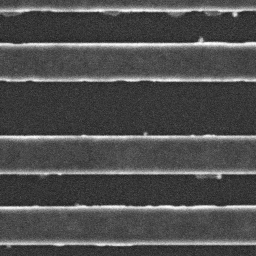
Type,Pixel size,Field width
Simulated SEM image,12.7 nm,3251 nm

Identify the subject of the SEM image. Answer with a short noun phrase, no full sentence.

lines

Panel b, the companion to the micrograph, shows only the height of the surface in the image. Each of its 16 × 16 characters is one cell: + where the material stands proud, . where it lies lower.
++++++++++++++++
................
................
++++++++++++++++
++++++++++++++++
................
................
................
............+...
++++++++++++++++
++++++++++++++++
................
................
++++++++++++++++
++++++++++++++++
................